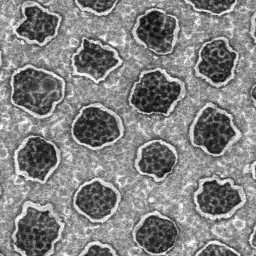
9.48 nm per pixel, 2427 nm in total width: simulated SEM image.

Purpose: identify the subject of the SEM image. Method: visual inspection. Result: a regular array of raised bodies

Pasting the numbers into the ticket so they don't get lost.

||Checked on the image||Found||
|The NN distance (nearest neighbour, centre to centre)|628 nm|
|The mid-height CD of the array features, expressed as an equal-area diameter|402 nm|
